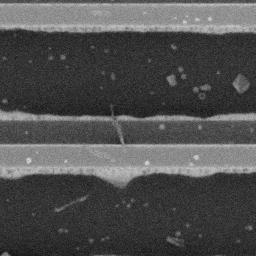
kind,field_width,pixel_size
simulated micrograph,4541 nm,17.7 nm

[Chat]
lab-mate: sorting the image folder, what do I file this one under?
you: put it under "lines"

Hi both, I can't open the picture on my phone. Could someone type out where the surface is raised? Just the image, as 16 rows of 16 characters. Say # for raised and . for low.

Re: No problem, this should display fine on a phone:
################
################
................
................
................
................
................
##.....#........
################
################
################
................
................
................
................
................